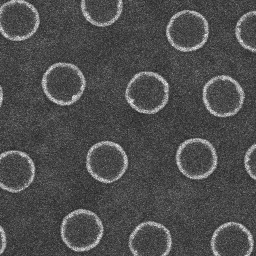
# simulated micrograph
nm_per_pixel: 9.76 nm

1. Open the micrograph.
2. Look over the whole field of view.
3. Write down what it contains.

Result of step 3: raised bodies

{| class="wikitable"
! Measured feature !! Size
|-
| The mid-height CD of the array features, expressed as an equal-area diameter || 40.8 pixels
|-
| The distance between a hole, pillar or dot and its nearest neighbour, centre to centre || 713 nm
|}